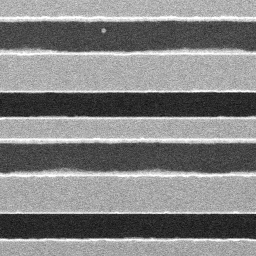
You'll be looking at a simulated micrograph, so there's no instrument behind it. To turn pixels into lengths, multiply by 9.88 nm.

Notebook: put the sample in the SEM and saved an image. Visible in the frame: lines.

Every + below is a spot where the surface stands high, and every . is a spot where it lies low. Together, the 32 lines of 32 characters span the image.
++++++++++++++++++++++++++++++++
++++++++++++++++++++++++++++++++
................................
................................
................................
................................
................................
++++++++++++++++++++++++++++++++
++++++++++++++++++++++++++++++++
++++++++++++++++++++++++++++++++
++++++++++++++++++++++++++++++++
................................
................................
................................
................................
++++++++++++++++++++++++++++++++
++++++++++++++++++++++++++++++++
+++++++++++++++++.++++++++++++++
................................
................................
................................
................................
++++++++++++++++++++++++++++++++
++++++++++++++++++++++++++++++++
++++++++++++++++++++++++++++++++
++++++++++++++++++++++++++++++++
++++++++++++++++++++++++++++++++
................................
................................
................................
++++++++++++++++++++++++++++++++
++++++++++++++++++++++++++++++++